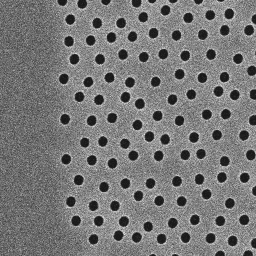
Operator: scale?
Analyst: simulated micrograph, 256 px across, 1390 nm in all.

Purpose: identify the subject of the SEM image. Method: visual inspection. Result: a regular array of holes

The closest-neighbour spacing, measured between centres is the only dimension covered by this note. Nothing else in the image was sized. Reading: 104 nanometers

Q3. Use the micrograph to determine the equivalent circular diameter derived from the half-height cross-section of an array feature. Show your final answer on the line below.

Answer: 55.8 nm